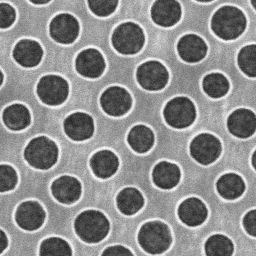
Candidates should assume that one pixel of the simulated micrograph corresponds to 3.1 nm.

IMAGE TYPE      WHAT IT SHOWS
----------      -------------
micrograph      a regular array of holes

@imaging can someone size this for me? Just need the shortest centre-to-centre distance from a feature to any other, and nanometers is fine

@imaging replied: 137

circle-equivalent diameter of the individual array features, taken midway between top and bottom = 0.0991 um